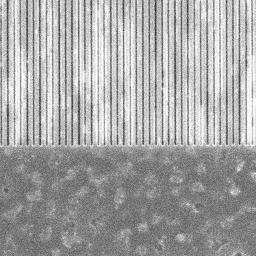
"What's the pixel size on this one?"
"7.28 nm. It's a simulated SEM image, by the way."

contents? parallel lines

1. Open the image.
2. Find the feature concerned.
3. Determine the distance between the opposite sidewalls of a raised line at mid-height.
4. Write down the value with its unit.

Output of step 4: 35.5 nm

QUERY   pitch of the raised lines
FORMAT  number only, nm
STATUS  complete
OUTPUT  46.9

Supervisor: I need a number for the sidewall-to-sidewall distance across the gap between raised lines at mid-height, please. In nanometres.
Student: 14.6